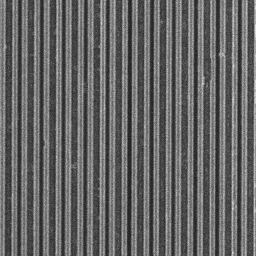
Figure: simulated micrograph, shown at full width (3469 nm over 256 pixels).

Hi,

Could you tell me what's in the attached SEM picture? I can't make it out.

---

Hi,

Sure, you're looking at parallel lines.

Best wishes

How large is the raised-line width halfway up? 67.8 nanometres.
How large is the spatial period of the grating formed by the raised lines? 148 nm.